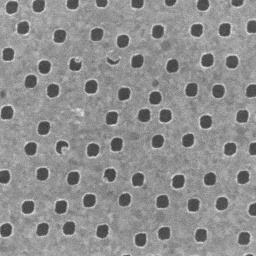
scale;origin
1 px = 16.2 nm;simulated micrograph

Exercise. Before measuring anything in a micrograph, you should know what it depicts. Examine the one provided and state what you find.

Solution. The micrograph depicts a regular array of holes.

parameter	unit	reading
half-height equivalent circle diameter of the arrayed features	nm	229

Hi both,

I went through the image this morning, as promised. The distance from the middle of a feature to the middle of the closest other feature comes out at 429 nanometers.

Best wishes